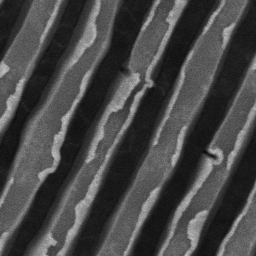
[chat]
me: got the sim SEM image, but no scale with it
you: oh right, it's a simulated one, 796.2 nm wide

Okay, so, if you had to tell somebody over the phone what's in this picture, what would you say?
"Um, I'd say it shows parallel lines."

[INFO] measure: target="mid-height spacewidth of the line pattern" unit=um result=0.0766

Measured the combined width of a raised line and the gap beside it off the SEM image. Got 0.173 um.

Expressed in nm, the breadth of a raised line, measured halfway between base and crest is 97.7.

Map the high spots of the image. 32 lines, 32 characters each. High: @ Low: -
----@@@@----@@@----@@@@----@@@@-
---@@@@----@@@@----@@@@----@@@--
---@@@@----@@@----@@@@----@@@@--
---@@@@---@@@@----@@@@----@@@---
--@@@@----@@@@---@@@@----@@@@---
-@@@@@---@@@@@---@@@@---@@@@----
-@@@@----@@@@---@@@@----@@@@----
@@@@@---@@@@@---@@@@---@@@@-----
@@@@----@@@@----@@@----@@@@----@
@@@@---@@@@@---@@@@---@@@@@----@
@@@----@@@@----@@@@---@@@@----@@
@@@---@@@@@---@@@@----@@@@----@@
@@----@@@@----@@@@---@@@@@---@@@
@@---@@@@@---@@@@----@@@@----@@@
@@--@@@@@----@@@@---@@@@@---@@@@
@--@@@@@@---@@@@----@@@@----@@@@
---@@@@@----@@@@---@@@@----@@@@-
---@@@@@---@@@@----@@@@----@@@@-
--@@@@@@---@@@@----@@@@---@@@@--
--@@@@@@--@@@@----@@@@----@@@@--
--@@@@@---@@@@----@@@@---@@@@---
-@@@@@@---@@@----@@@@@---@@@@---
-@@@@@---@@@@----@@@@---@@@@----
@@@@@---@@@@----@@@@----@@@@----
@@@@----@@@@----@@@@---@@@@----@
@@@@---@@@@@---@@@@---@@@@@----@
@@@----@@@@---@@@@@---@@@@----@@
@@@---@@@@@---@@@@---@@@@@---@@@
@@----@@@@----@@@@---@@@@----@@@
@----@@@@@---@@@@----@@@@---@@@@
@---@@@@@----@@@@---@@@@@--@@@@@
----@@@@@---@@@@----@@@@---@@@@-